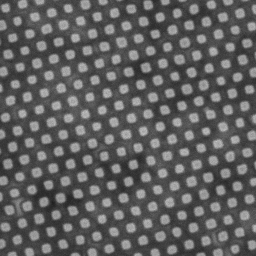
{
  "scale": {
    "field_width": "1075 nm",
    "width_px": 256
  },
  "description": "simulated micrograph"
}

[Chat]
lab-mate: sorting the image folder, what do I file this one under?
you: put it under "a regular array of raised bodies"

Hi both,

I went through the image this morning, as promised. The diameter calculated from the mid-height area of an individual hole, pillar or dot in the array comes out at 40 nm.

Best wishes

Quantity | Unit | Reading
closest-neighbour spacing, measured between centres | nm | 71.9